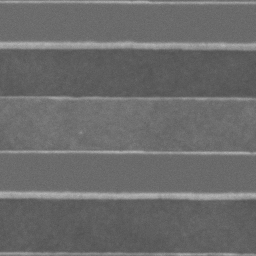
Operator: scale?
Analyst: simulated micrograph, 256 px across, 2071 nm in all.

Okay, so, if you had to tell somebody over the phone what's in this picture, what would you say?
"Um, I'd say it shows lines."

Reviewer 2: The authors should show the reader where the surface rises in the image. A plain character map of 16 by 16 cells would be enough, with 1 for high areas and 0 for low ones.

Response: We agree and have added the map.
1111111111111111
1111111111111111
1111111111111111
0000000000000000
0000000000000000
0000000000000000
1111111111111111
1111111111111111
1111111111111111
1111111111111111
1111111111111111
1111111111111111
0000000000000000
0000000000000000
0000000000000000
0000000000000000